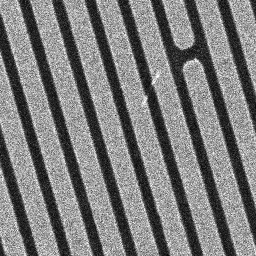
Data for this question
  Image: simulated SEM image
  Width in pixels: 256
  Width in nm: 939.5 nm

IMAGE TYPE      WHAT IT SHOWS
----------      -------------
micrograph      parallel lines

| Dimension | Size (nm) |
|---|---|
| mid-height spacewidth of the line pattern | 36.1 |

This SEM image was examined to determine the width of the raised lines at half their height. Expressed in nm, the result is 81.8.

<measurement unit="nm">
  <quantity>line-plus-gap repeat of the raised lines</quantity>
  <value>116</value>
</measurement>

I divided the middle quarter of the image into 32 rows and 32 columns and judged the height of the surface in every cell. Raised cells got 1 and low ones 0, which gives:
11001111110001111100011111100011
11000111110001111110011111100011
11000111111001111110011111100011
11100111111000111110001111110011
11100011111000111110001111110011
11100011111100111111001111110001
11110011111100111111000111110001
11110011111100011111100111111001
11110001111100011111100111111000
11110001111110011111100111111000
11111001111110011111100011111100
11111000111110001111100011111100
11111000111111001111110011111100
11111100111111001111110001111100
11111100111111000111110001111110
01111100011111100111111001111110
01111100011111100111111000111110
01111110011111100111111000111111
01111110001111100011111100111111
00111110001111110011111100111111
00111111001111110011111100011111
00111111001111110001111100011111
00011111000111111001111110011111
00011111000111111001111110001111
10011111100111111000111110001111
10001111100011111000111111001111
10001111100011111100111111001111
11001111110011111100111111000111
11001111110001111100011111000111
11000111110001111110011111100111
11000111111001111110011111100011
11100111111001111110001111100011